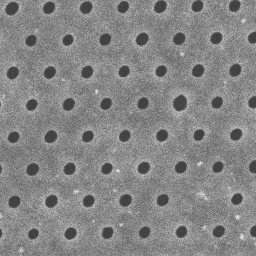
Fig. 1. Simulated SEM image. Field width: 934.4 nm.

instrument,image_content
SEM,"a regular array of holes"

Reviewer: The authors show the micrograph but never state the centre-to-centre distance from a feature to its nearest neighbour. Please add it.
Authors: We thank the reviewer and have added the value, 134 nanometres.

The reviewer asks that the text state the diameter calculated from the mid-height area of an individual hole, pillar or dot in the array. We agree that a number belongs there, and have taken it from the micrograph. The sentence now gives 12.1 px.